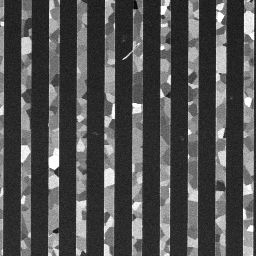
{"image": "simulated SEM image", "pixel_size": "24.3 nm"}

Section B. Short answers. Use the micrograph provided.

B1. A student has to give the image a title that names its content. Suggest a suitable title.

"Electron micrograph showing parallel lines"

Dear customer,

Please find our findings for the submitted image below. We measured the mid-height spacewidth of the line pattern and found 0.443 microns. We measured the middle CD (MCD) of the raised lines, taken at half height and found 0.234 micrometres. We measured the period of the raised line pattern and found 0.675 µm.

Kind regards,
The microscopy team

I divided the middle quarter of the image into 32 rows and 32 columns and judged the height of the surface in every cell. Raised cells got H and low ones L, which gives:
LLLHHHLLLLHHHLLLLHHHLLLLHHHLLLLH
LLLHHHLLLLHHHLLLLHHHLLLLHHHLLLLH
LLLHHHLLLLHHHLLLLHHHLLLLHHHLLLLH
LLLHHHLLLLHHHLLLLHHHLLLLHHHLLLLH
LLLHHHLLLLHHHLLLLHHHLLLLHHHLLLLH
LLLHHHLLLLHHHLLLLHHHLLLLHHHLLLLH
LLLHHHLLLLHHHLLLLHHHLLLLHHHLLLLH
LLLHHHLLLLHHHLLLLHHHLLLLHHHLLLLH
LLLHHHLLLLHHHLLLLHHHLLLLHHHLLLLH
LLLHHHLLLLHHHLLLLHHHLLLLHHLLLLLH
LLLHHHLLLLHHHLLLLHHHLLLLHHLLLLLH
LLLHHHLLLLHHHLLLLHHHLLLLHHLLLLLH
LLLHHHLLLLHHHLLLLHHHLLLLHHLLLLLH
LLLHHHLLLLHHHLLLLHHLLLLLHHLLLLLH
LLLHHHLLLLHHHLLLLHHLLLLLHHLLLLLH
LLLHHHLLLLHHHLLLLHHLLLLLHHLLLLLH
LLLHHHLLLLHHHLLLLHHLLLLLHHLLLLLH
LLLHHHLLLLHHLLLLLHHLLLLLHHLLLLLH
LLLHHHLLLLHHLLLLLHHLLLLLHHLLLLLH
LLLHHHLLLLHHLLLLLHHLLLLLHHLLLLLH
LLLHHHLLLLHHLLLLLHHLLLLLHHLLLLLH
LLLHHLLLLLHHLLLLLHHLLLLLHHLLLLLH
LLLHHLLLLLHHLLLLLHHLLLLLHHLLLLLH
LLLHHLLLLLHHLLLLLHHLLLLLHHLLLLLH
LLLHHLLLLLHHLLLLLHHLLLLLHHLLLLLH
LLLHHLLLLLHHLLLLLHHLLLLLHHLLLLLH
LLLHHLLLLLHHLLLLLHHLLLLLHHLLLLLH
LLLHHLLLLLHHLLLLLHHLLLLLHHLLLLLH
LLLHHLLLLLHHLLLLLHHLLLLLHHLLLLLH
LLLHHLLLLLHHLLLLLHHLLLLLHHLLLLLH
LLLHHLLLLLHHLLLLLHHLLLLLHHLLLLLH
LLLHHLLLLLHHLLLLLHHLLLLLHHLLLLLH